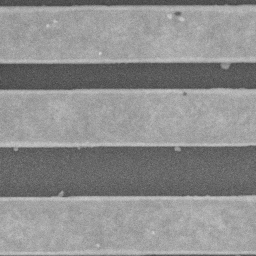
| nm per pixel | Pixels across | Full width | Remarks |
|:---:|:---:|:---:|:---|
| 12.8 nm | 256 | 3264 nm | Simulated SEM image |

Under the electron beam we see lines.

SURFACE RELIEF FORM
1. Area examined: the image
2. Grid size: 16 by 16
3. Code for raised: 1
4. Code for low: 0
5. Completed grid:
1111111111111111
1111111111111111
1111111111111111
1111111111111111
0000000000000000
0000000000000000
1111111111111111
1111111111111111
1111111111111111
0000000000000000
0000000000000000
0000000000000000
1111111111111111
1111111111111111
1111111111111111
1111111111111111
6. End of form